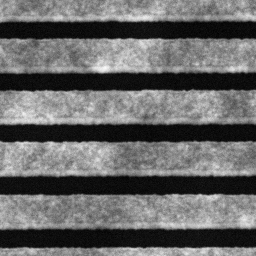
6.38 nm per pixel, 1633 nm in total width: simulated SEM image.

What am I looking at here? lines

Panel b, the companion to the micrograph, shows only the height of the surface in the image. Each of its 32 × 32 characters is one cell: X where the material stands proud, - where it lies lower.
XXXXXXXXXXXXXXXXXXXXXXXXXXXXXXXX
XXXXXXXXXXXXXXXXXXXXXXXXXXXXXXXX
X--XXXXXXXXX----X-----XX-------X
--------------------------------
--------------------------------
XXXXXXXXXXXXXXXXXXXXXXXXXXXXXXXX
XXXXXXXXXXXXXXXXXXXXXXXXXXXXXXXX
XXXXXXXXXXXXXXXXXXXXXXXXXXXXXXXX
XXXXXXXXXXXXXXXXXXXXXXXXXXXXXXXX
--------------------------------
--------------------------------
XXXXXXXXXXXXXXXXXXXXXXXXXXXXXXXX
XXXXXXXXXXXXXXXXXXXXXXXXXXXXXXXX
XXXXXXXXXXXXXXXXXXXXXXXXXXXXXXXX
XXXXXXXXXXXXXXXXXXXXXXXXXXXXXXXX
--------------------------------
--------------------------------
--------------------------------
XXXXXXXXXXXXXXXXXXXXXXXXXXXXXXXX
XXXXXXXXXXXXXXXXXXXXXXXXXXXXXXXX
XXXXXXXXXXXXXXXXXXXXXXXXXXXXXXXX
XXXXXXXXXXXXXXXXXXXXXXXXXXXXXXXX
--------------------------------
--------------------------------
XXXXXXXXXXXXXXXXXXXXXXXXXXXXXXXX
XXXXXXXXXXXXXXXXXXXXXXXXXXXXXXXX
XXXXXXXXXXXXXXXXXXXXXXXXXXXXXXXX
XXXXXXXXXXXXXXXXXXXXXXXXXXXXXXXX
X--X----------------------------
--------------------------------
--------------------------------
XXXXXXXXXXXXXXXXXXXXXXXXXXXXXXXX